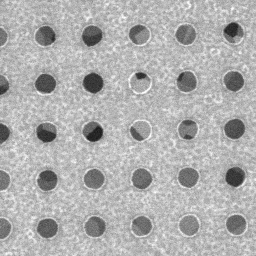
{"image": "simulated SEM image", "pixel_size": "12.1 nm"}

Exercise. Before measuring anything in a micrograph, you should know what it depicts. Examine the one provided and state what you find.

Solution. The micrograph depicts a regular array of raised bodies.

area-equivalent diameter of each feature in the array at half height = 0.265 microns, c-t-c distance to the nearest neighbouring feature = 565 nanometers